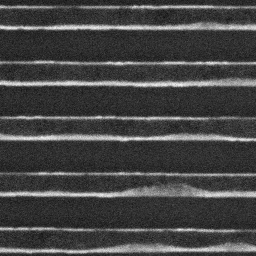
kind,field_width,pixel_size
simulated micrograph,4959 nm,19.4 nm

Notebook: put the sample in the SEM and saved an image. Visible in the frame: lines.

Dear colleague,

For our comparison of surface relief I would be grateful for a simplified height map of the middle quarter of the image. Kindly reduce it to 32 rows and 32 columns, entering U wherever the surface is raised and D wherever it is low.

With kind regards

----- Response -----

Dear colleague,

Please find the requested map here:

UUUUUUUUUUUUUUUUUUUUUUUUUUUUUUUU
UUUUUUUUUUUUUUUUUUUUUUUUUUUUUUUU
UUUUUUUUUUUUUUUUUUUUUUUUUUUUUUUU
UUUUUUUUUUUUUUUUUUUUUUUUUUUUUUUU
UUUUUUUUUUUUUUUUUUUUUUUUUUUUUUUU
DDDDDDDDDDDDDDDDDDDDDDDDDDDDDDDD
DDDDDDDDDDDDDDDDDDDDDDDDDDDDDDDD
DDDDDDDDDDDDDDDDDDDDDDDDDDDDDDDD
DDDDDDDDDDDDDDDDDDDDDDDDDDDDDDDD
DDDDDDDDDDDDDDDDDDDDDDDDDDDDDDDD
DDDDDDDDDDDDDDDDDDDDDDDDDDDDDDDD
DDDDDDDDDDDDDDDDDDDDDDDDDDDDDDDD
DDDDDDDDDDDDDDDDDDDDDDDDDDDDDDDD
UUUUUUUUUUDDDDDDDDDDDDDDDDDDDDDD
UUUUUUUUUUUUUUUUUUUUUUUUUUUUUUUU
UUUUUUUUUUUUUUUUUUUUUUUUUUUUUUUU
UUUUUUUUUUUUUUUUUUUUUUUUUUUUUUUU
UUUUUUUUUUUUUUUUUUUUUUUUUUUUUUUU
DDDDDDDDDDDDDDUUUUUUUUDDDDDDDDDD
DDDDDDDDDDDDDDDDDDDDDDDDDDDDDDDD
DDDDDDDDDDDDDDDDDDDDDDDDDDDDDDDD
DDDDDDDDDDDDDDDDDDDDDDDDDDDDDDDD
DDDDDDDDDDDDDDDDDDDDDDDDDDDDDDDD
DDDDDDDDDDDDDDDDDDDDDDDDDDDDDDDD
DDDDDDDDDDDDDDDDDDDDDDDDDDDDDDDD
DDDDDDDDDDDDDDDDDDDDDDDDDDDDDDDD
DDDDDDDDDDDDDDDDDDDDDDDDDDDDDDDD
UUUUUUUUUUUUUUUUDDDDDDDDDDDDDDDD
UUUUUUUUUUUUUUUUUUUUUUUUUUUUUUUU
UUUUUUUUUUUUUUUUUUUUUUUUUUUUUUUU
UUUUUUUUUUUUUUUUUUUUUUUUUUUUUUUU
UUUUUUUUUUUUUUUUUUUUUUUUUUUUUUUU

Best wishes